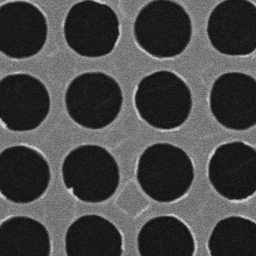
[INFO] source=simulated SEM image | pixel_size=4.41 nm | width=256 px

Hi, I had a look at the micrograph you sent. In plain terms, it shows holes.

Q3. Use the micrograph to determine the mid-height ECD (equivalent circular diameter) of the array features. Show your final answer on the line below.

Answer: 250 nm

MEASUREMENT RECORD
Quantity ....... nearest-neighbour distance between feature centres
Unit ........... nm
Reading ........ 312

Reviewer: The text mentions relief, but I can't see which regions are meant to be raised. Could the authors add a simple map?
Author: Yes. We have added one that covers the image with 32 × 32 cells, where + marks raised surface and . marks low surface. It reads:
+...++++++...+++++....+++++.....
.....++++.....+++......++++.....
......++.......++.......++......
......++.......++.......++......
......++.......++.......++......
......+++.....+++......+++......
.....+++++....+++++....+++++...+
++++++++++++++++++++++++++++++++
++++++++++++++++++++++++++++++++
+...++++++....+++++...++++++...+
.....++++......++......++++.....
......++.......++.......++......
......++.......++.......++......
......++.......++.......++......
......+++......+++.....++++.....
+....+++++....+++++....+++++....
++++++++++++++++++++++++++++++++
++++++++++++++++++++++++++++++++
+...++++++...++++++...+++++....+
.....+++......++++.....++++.....
......++.......++.......++......
......++.......++.......++......
......++.......++.......++......
......+++......+++.....++++.....
+....+++++....+++++...++++++...+
++++++++++++++++++++++++++++++++
++++++++++++++++++++++++++++++++
+...++++++...++++++...++++++...+
......+++......+++.....++++.....
......++.......++.......++......
......++.......++.......++......
......++.......++.......++......